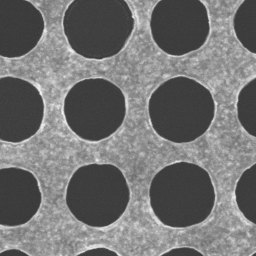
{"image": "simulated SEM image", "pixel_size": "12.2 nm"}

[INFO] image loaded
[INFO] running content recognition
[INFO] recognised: holes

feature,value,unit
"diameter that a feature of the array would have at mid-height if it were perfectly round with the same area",791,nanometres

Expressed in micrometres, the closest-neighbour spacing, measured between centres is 1.04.